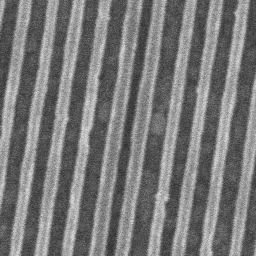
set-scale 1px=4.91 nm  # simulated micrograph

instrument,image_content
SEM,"parallel lines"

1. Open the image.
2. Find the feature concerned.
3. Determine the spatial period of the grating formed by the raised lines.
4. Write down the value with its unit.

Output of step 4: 133 nm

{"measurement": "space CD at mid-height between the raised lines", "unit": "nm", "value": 80.2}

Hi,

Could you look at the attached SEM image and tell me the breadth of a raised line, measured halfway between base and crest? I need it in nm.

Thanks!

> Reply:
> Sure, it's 51.6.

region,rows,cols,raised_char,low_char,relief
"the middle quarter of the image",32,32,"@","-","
@@-----@@-----@@@---@@@-----@@--
@@-----@@-----@@@---@@@-----@@--
@@----@@@-----@@@---@@@-----@@--
@@----@@------@@@---@@@-----@@--
@@----@@-----@@@---@@@@-----@@--
@@----@@-----@@@---@@@-----@@@--
@-----@@-----@@@---@@@-----@@@--
@-----@@-----@@@---@@@-----@@@--
@-----@@-----@@@---@@@-----@@---
@----@@@----@@@@---@@@-----@@---
@----@@@----@@@---@@@@-----@@---
@----@@-----@@@---@@@-----@@@---
-----@@-----@@@---@@@-----@@@---
@----@@-----@@@---@@@-----@@@---
-----@@-----@@@---@@@-----@@@---
-----@@-----@@@---@@@-----@@----
----@@-----@@@---@@@@-----@@----
----@@-----@@@---@@@@-----@@----
----@@-----@@@---@@@-----@@@----
----@@-----@@@---@@@-----@@@----
----@@-----@@@---@@@-----@@@----
----@@----@@@@---@@@-----@@----@
----@@----@@@@---@@@-----@@----@
---@@@----@@@----@@@-----@@----@
---@@-----@@@---@@@------@@----@
---@@-----@@@---@@@------@@----@
---@@-----@@@---@@@-----@@@---@@
---@@----@@@@---@@@-----@@@---@@
---@@----@@@@---@@@-----@@----@@
--@@@----@@@----@@@-----@@----@@
--@@@----@@@----@@@-----@@----@@
--@@-----@@@---@@@------@@----@@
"